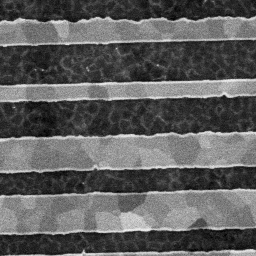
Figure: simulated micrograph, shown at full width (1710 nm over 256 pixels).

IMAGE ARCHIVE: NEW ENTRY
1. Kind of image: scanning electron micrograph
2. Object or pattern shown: one or a few lines or trenches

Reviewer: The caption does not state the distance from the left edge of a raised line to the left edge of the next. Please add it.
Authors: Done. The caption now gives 403 nanometres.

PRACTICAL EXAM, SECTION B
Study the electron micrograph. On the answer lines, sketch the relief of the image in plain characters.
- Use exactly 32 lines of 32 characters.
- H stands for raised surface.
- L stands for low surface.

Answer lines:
LLLLLLLLLLLLLLLLLLLLLLLLLLLLLLLL
LLLLLLLLLLLLLLLLLLLLLLLLLLLLLLLL
LLHHLLLLLLLHHHLHLLHHHLLHLHHHHHHH
HHHHHHHHHHHHHHHHHHHHHHHHHHHHHHHH
HHHHHHHHHHHHHHHHHHHHHHHHHHHHHHHH
HHHHHLHLLLLLLLLLLLLLLLLLLLLLLLLL
LLLLLLLLLLLLLLLLLLLLLLLLLLLLLLLL
LLLLLLLLLLLLLLLLLLLLLLLLLLLLLLLL
LLLLLLLLLLLLLLLLLLLLLLLLLLLLLLLL
LLLLLLLLLLLLLLLLLLLLLLLLLLLLLLLL
LLLLLLLLLLLHHHHHHHHHHHHHHHHHHHHH
HHHHHHHHHHHHHHHHHHHHHHHHHHHHHHHH
HHHHHHHLLHLLLLLLLLLLLLLLLLLLLLLL
LLLLLLLLLLLLLLLLLLLLLLLLLLLLLLLL
LLLLLLLLLLLLLLLLLLLLLLLLLLLLLLLL
LLLLLLLLLLLLLLLLLLLLLLLLLLLLLLLL
LLLLLLLLLLLLLLLLLLLLLLLLLLLLLLLL
HHHHHHHHHHHHHHHHHHHHHHHHHHHHHHHH
HHHHHHHHHHHHHHHHHHHHHHHHHHHHHHHH
HHHHHHHHHHHHHHHHHHHHHHHHHHHHHHHH
HHHHHHHHHHHHHHHHHHHHHHHHHHHHHHHH
HHLLLLLLLLLLLLLLLLLLLLLLLLLLLLLL
LLLLLLLLLLLLLLLLLLLLLLLLLLLLLLLL
LLLLLLLLLLLLLLLLLLLLLLLLLLLLLLLL
LHHLLHHHHHHHHHHHHHHHHHHHHHHHHHHH
HHHHHHHHHHHHHHHHHHHHHHHHHHHHHHHH
HHHHHHHHHHHHHHHHHHHHHHHHHHHHHHHH
HHHHHHHHHHHHHHHHHHHHHHHHHHHHHHHH
HHHHHHHHHHHHHHHHHHHHHHHHHHHHHHHL
LLLLLLLLLLLLLLLLLLLLLLLLLLLLLLLL
LLLLLLLLLLLLLLLLLLLLLLLLLLLLLLLL
LLLLLLLLLLLLLLLLLLLLLLHLLLHHHHHH